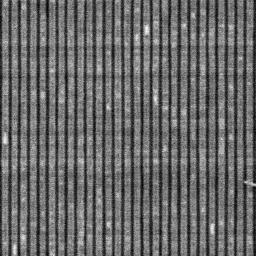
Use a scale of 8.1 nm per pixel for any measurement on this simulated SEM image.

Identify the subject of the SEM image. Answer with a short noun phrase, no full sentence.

parallel lines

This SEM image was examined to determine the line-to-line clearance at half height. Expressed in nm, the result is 29.4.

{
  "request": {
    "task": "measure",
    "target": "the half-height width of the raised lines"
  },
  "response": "0.0435 micrometres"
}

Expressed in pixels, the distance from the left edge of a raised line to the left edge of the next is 9.42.